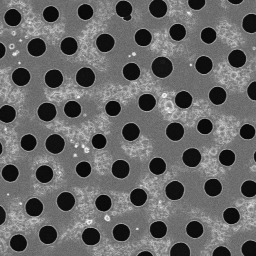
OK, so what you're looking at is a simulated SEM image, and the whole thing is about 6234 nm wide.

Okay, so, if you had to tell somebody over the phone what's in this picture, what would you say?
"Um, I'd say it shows a regular array of holes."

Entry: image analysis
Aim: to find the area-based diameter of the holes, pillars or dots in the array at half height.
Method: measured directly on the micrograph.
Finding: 0.426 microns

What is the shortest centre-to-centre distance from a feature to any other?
0.778 um